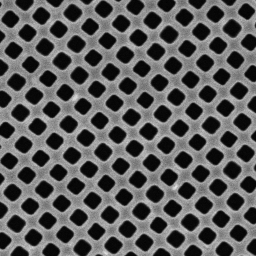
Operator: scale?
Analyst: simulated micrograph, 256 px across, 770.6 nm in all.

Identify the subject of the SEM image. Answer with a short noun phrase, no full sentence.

a regular array of holes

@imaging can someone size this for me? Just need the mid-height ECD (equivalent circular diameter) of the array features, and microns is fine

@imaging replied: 0.048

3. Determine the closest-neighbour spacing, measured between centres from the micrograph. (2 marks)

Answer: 65.9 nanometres